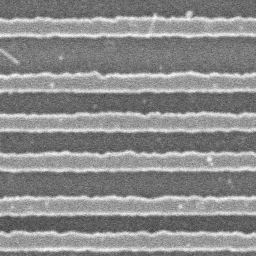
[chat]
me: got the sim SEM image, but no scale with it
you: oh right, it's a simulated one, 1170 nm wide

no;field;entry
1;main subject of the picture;lines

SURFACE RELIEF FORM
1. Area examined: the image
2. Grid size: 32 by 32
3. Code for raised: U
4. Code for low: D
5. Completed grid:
DDDDDDDDDDDDDDDDDDDDDDDDDDDDDDDD
DDDDDDDDDDDDDDDDDDDDDDDDDDDDDDDD
UDUUUUUUUUUUUUUUUUUUUUUUUUUUUUUU
UUUUUUUUUUUUUUUUUUUUUUUUUUUUUUUU
UUUUUUUUUUUUUUUUUUUUDDUUUUUUDDDU
DDDDDDDDDDDDDDDDDDDDDDDDDDDDDDDD
DDDDDDDDDDDDDDDDDDDDDDDDDDDDDDDD
DDDDDDDDDDDDDDDDDDDDDDDDDDDDDDDD
DDDDDDDDDDDDDDDDDDDDDDDDDDDDDDDD
UUUUUUUUUUUUUUUUUUUUUUUUUUUUUUUU
UUUUUUUUUUUUUUUUUUUUUUUUUUUUUUUU
DDDDDDDDDDDDDDDDDDDDDDDDDDDDDDDD
DDDDDDDDDDDDDDDDDDDDDDDDDDDDDDDD
DDDDDDDDDDDDDDDDDDDDDDDDDDDDDDDD
UUUUUUUUUUUUUUUUUUUUUUUUUUUUUUUU
UUUUUUUUUUUUUUUUUUUUUUUUUUUUUUUU
DDDDDDDDDDDDDDDDDDDDDDDDDDDDDDDD
DDDDDDDDDDDDDDDDDDDDDDDDDDDDDDDD
DDDDDDDDDDDDDDDDDDDDDDDDDDDDDDDD
UUUUUUUUUUUUUUUUUUUUUUUUUUUUUUUU
UUUUUUUUUUUUUUUUUUUUUUUUUUUUUUUU
DDDDDDDDDDDDDDDDDDDDDDDDDDDDDDDD
DDDDDDDDDDDDDDDDDDDDDDDDDDDDDDDD
DDDDDDDDDDDDDDDDDDDDDDDDDDDDDDDD
DDDDDDDDDDDDDDDDDDDDDDDDDDDDDDDD
UUUUUUUUUUUUUUUUUUUUUUUUUUUUUUUU
UUUUUUUUUUUUUUUUUUUUUUUUUUUUUUUU
DDDDDDDDDDDDDDDDDDDDDDDDDDDDDDDD
DDDDDDDDDDDDDDDDDDDDDDDDDDDDDDDD
UUUUUUUUUUUUUUUUUUUUUUUUUUUUUUUU
UUUUUUUUUUUUUUUUUUUUUUUUUUUUUUUU
DDDDDDDDDDDDDDDDDDDDDDDDDDDDDDDD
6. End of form